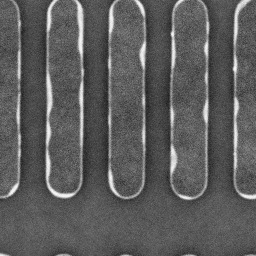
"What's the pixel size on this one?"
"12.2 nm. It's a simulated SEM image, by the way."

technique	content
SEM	groups of lines, slits or small figures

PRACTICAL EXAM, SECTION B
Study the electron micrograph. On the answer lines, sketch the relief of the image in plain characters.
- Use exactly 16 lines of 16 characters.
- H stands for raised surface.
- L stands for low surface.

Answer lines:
HLLHHLLHHLLHHLLH
HLLHHLLHHLLHHLLH
HLLHHLLHHLLHHLLH
HLLHHLLHHLLHHLLH
HLLHHLLHHLLHHLLH
HLLHHLLHHLLHHLLH
HLLHHLLHHLLHHLLH
HLLHHLLHHLLHHLLH
HLLHHLLHHLLHHLLH
HLLHHLLHHLLHHLLH
HLLHHLLHHLLHHLLH
HLLHHLLHHLLHHLLH
LLLLLLLLLLLLLLLL
LLLLLLLLLLLLLLLL
LLLLLLLLLLLLLLLL
LLLLLLLLLLLLLLLL